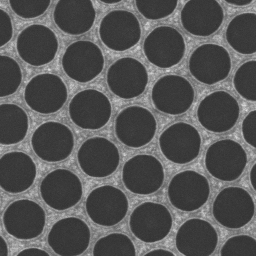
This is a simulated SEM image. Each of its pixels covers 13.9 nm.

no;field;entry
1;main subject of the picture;a regular array of holes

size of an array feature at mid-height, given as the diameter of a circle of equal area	41.3	pixels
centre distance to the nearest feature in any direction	664	nm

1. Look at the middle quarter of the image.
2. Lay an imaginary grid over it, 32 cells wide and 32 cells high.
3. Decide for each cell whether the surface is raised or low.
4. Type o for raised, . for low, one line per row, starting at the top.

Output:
..........oo........ooo....oooo.
.........oo..........oooooooooo.
o........oo..........ooooooooooo
oo......ooo..........ooo......oo
oooo..ooooo..........oo........o
ooooooooooo.........oo..........
.oooo...oooo........oo..........
.oo.......ooo......ooo..........
.o.........ooo...ooooo..........
oo.........ooooooooooo..........
o...........ooooo.ooooo.........
o...........ooo......ooo.......o
o...........oo........oooo...ooo
oo.........oo..........ooooooooo
oo.........oo..........oooooo.oo
oooo......ooo..........oooo.....
..ooooooooooo..........oo.......
..ooooooooooo..........o........
..ooooo...ooo.........oo........
...oo.......oo.......ooo........
..oo.........ooo....oooo........
..oo..........oooooooooo........
..o...........ooooooooooo.......
.oo...........ooo......ooo......
oooo..........oo........ooo....o
oooo.........oo..........ooooooo
.oooo........oo..........ooooooo
...ooo......ooo..........ooo....
....oooooooooo...........oo.....
....ooooooooooo..........oo.....
....oooooo..ooo.........oo......
.....ooo......oo.......ooo......